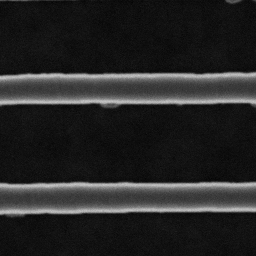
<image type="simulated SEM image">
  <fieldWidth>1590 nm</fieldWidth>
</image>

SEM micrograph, lines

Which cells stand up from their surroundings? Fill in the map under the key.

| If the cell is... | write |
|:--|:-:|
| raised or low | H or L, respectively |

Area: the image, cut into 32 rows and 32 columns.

LLLLLLLLLLLLLLLLLLLLLLLLLLLLLLLL
LLLLLLLLLLLLLLLLLLLLLLLLLLLLLLLL
LLLLLLLLLLLLLLLLLLLLLLLLLLLLLLLL
LLLLLLLLLLLLLLLLLLLLLLLLLLLLLLLL
LLLLLLLLLLLLLLLLLLLLLLLLLLLLLLLL
LLLLLLLLLLLLLLLLLLLLLLLLLLLLLLLL
LLLLLLLLLLLLLLLLLLLLLLLLLLLLLLLL
LLLLLLLLLLLLLLLLLLLLLLLLLLLLLLLL
LLLLLLLLLLLLLLLLLLLLLLLLLLLLLLLL
LLHHHHHHHHHHHHHHHHHHHHHHHHHHHHHH
HHHHHHHHHHHHHHHHHHHHHHHHHHHHHHHH
HHHHHHHHHHHHHHHHHHHHHHHHHHHHHHHH
HHHHHHHHHHHHHHHHHHHHHHHHHHHHHHHH
LLLLLLLLLLLLLLLLLLLLLLLLLLLLLLLL
LLLLLLLLLLLLLLLLLLLLLLLLLLLLLLLL
LLLLLLLLLLLLLLLLLLLLLLLLLLLLLLLL
LLLLLLLLLLLLLLLLLLLLLLLLLLLLLLLL
LLLLLLLLLLLLLLLLLLLLLLLLLLLLLLLL
LLLLLLLLLLLLLLLLLLLLLLLLLLLLLLLL
LLLLLLLLLLLLLLLLLLLLLLLLLLLLLLLL
LLLLLLLLLLLLLLLLLLLLLLLLLLLLLLLL
LLLLLLLLLLLLLLLLLLLLLLLLLLLLLLLL
LLLLLLLLLLLLLLLLLLLLLLLLLLLLLLLL
HHHHHHHHHHHHHHHHHHHHHHHHHHHHHHHH
HHHHHHHHHHHHHHHHHHHHHHHHHHHHHHHH
HHHHHHHHHHHHHHHHHHHHHHHHHHHHHHHH
HHHHHHHHHHHLLLLLLLLLLLLLLLLLLLLL
LLLLLLLLLLLLLLLLLLLLLLLLLLLLLLLL
LLLLLLLLLLLLLLLLLLLLLLLLLLLLLLLL
LLLLLLLLLLLLLLLLLLLLLLLLLLLLLLLL
LLLLLLLLLLLLLLLLLLLLLLLLLLLLLLLL
LLLLLLLLLLLLLLLLLLLLLLLLLLLLLLLL